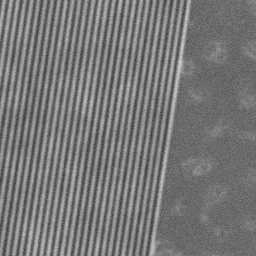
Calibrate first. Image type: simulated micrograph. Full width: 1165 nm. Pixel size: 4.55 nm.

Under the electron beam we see parallel lines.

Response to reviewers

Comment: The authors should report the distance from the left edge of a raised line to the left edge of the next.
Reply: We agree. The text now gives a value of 30.7 nanometers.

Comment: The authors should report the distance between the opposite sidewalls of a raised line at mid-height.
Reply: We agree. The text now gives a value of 16.3 nm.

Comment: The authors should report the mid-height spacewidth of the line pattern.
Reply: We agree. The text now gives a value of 16.3 nm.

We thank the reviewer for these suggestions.